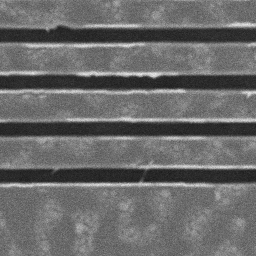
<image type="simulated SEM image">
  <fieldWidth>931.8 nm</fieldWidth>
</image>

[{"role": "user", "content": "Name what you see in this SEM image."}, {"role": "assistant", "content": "parallel lines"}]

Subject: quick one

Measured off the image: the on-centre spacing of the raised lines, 170 nanometers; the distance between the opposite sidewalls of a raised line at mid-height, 120 nanometers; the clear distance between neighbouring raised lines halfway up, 51.4 nanometers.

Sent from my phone